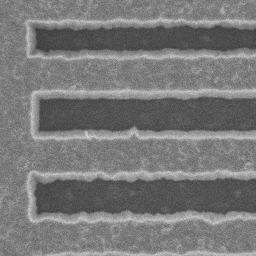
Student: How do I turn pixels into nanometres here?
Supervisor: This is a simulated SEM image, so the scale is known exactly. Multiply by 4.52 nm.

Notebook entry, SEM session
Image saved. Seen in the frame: one or a few lines or trenches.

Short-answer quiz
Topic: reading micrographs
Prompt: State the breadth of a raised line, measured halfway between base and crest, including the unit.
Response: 186 nm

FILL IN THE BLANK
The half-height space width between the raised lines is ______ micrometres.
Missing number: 0.174